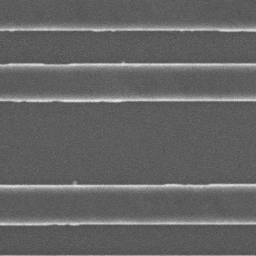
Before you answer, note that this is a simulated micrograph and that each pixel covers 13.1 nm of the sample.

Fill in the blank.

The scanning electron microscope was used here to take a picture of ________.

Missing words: lines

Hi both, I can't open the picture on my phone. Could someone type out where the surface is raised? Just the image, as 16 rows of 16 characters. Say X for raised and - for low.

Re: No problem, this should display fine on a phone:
XXXXXXXXXXXXXXXX
XXXXXXXXXXXXXXXX
----------------
----------------
XXXXXXXXXXXXXXXX
XXXXXXXXXXXXXXXX
----------------
----------------
----------------
----------------
----------------
----------------
XXXXXXXXXXXXXXXX
XXXXXXXXXXXXXXXX
----------------
----------------